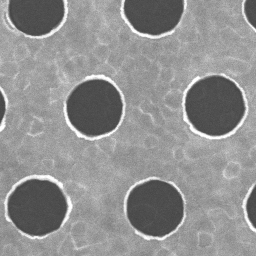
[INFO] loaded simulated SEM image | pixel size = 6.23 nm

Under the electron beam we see holes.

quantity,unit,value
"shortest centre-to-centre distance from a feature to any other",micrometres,0.725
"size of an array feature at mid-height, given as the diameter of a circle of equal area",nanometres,356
